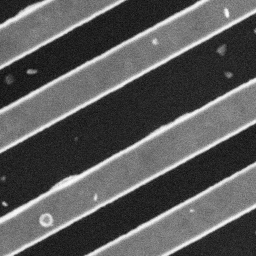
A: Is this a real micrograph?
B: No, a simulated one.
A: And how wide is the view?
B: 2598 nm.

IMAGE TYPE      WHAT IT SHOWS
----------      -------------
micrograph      lines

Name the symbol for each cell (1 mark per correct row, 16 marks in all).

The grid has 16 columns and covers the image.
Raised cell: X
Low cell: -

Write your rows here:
--XXXXX-----XXXX
XXXXX-----XXXXX-
XXX-----XXXXX---
XX----XXXXX-----
----XXXXX-------
---XXXX--------X
-XXXXX-------XXX
XXXX-------XXXXX
XX-------XXXXX--
--------XXXXX---
------XXXXX----X
----XXXXX-----XX
--XXXXX-----XXXX
XXXXX-----XXXXX-
XXXX----XXXXX---
XX----XXXXX-----